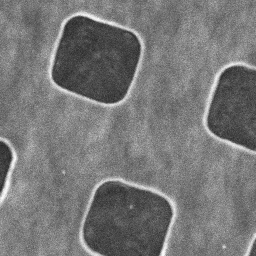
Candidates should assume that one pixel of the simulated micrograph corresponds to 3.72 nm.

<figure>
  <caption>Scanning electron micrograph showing holes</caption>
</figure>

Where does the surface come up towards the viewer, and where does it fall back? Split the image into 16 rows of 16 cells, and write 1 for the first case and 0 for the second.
1111111111111111
1111000111111111
1111000001111111
1110000001111111
1110000011111100
1111000011111000
1111111111111000
1111111111111000
1111111111111100
0111111111111111
0111111111111111
1111110011111111
1111110000111111
1111100000011111
1111100000111111
1111110000111111